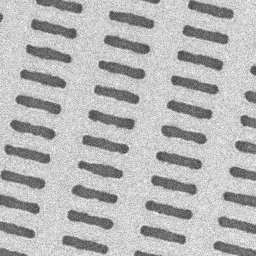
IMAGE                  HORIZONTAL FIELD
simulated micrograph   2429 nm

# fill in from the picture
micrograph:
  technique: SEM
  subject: a regular array of holes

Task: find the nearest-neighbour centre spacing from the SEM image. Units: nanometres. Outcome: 242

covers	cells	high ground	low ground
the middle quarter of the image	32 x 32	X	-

XXXXXXXXX--------XXXXXXXXXXXXXXX
XXXXXXXXXX----------XXXXXXXXXXXX
XXXXXXXXXXXXX-------XXXXXXXXXXXX
XXXXXXXXXXXXXXXXX---XXXXXXX-----
XXXXXXXXXXXXXXXXXXXXXXXXXXX-----
-XXXXXXX---XXXXXXXXXXXXXXXXX----
XXXXXXX---------XXXXXXXXXXXXXXXX
XXXXXXXX----------XXXXXXXXXXXXXX
XXXXXXXXXXX--------XXXXXXXXXXXXX
XXXXXXXXXXXXXXX----XXXXXXX----XX
XXXXXXXXXXXXXXXXXXXXXXXXXX------
XXXXXXX-XXXXXXXXXXXXXXXXXXX-----
XXXXXX------XXXXXXXXXXXXXXXXX---
XXXXXX----------XXXXXXXXXXXXXXXX
XXXXXXXX----------XXXXXXXXXXXXXX
XXXXXXXXXXXX------XXXXXXX--XXXXX
XXXXXXXXXXXXXXXXXXXXXXXX-------X
XXXXXXXXXXXXXXXXXXXXXXXX--------
XXXX------XXXXXXXXXXXXXXXXX-----
XXXX---------XXXXXXXXXXXXXXXXXX-
XXXXXX----------XXXXXXXXXXXXXXXX
XXXXXXXXXX------XXXXXXXXXXXXXXXX
XXXXXXXXXXXXXX--XXXXXXX------XXX
XXXXXXXXXXXXXXXXXXXXXXX---------
XXX---XXXXXXXXXXXXXXXXXXX-------
XXX---------XXXXXXXXXXXXXXXXX---
XXXXX---------XXXXXXXXXXXXXXXXXX
XXXXXXX--------XXXXXXXXXXXXXXXXX
XXXXXXXXXXX---XXXXXXXX----XXXXXX
XXXXXXXXXXXXXXXXXXXXXX---------X
XXX--XXXXXXXXXXXXXXXXXX---------
XX-------XXXXXXXXXXXXXXXXX------